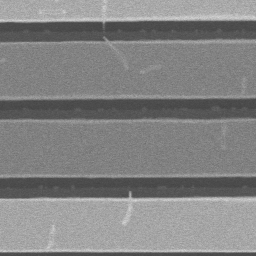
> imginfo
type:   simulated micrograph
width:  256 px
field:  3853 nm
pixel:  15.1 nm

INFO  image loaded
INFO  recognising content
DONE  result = lines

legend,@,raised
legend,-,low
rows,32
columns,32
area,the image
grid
@@@@@@@@@@@@@@@@@@@@@@@@@@@@@@@@
@@@@@@@@@@@@@@@@@@@@@@@@@@@@@@@@
@@@@@@@@@@@@@@@@@@@@@@@@@@@@@@@@
--------------------------------
--------------------------------
@@@@@@@@@@@@@@@@@@@@@@@@@@@@@@@@
@@@@@@@@@@@@@@@@@@@@@@@@@@@@@@@@
@@@@@@@@@@@@@@@@@@@@@@@@@@@@@@@@
@@@@@@@@@@@@@@@@@@@@@@@@@@@@@@@@
@@@@@@@@@@@@@@@@@@@@@@@@@@@@@@@@
@@@@@@@@@@@@@@@@@@@@@@@@@@@@@@@@
@@@@@@@@@@@@@@@@@@@@@@@@@@@@@@@@
@@------------------------------
--------------------------------
--------------------------------
@@@@@@@@@@@@@@@@@@@@@@@@@@@@@@@@
@@@@@@@@@@@@@@@@@@@@@@@@@@@@@@@@
@@@@@@@@@@@@@@@@@@@@@@@@@@@@@@@@
@@@@@@@@@@@@@@@@@@@@@@@@@@@@@@@@
@@@@@@@@@@@@@@@@@@@@@@@@@@@@@@@@
@@@@@@@@@@@@@@@@@@@@@@@@@@@@@@@@
@@@@@@@@@@@@@@@@@@@@@@@@@@@@@@@@
--------------------------------
--------------------------------
--------------------------------
@@@@@@@@@@@@@@@@@@@@@@@@@@@@@@@@
@@@@@@@@@@@@@@@@@@@@@@@@@@@@@@@@
@@@@@@@@@@@@@@@@@@@@@@@@@@@@@@@@
@@@@@@@@@@@@@@@@@@@@@@@@@@@@@@@@
@@@@@@@@@@@@@@@@@@@@@@@@@@@@@@@@
@@@@@@@@@@@@@@@@@@@@@@@@@@@@@@@@
--------------------------------